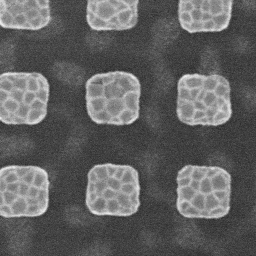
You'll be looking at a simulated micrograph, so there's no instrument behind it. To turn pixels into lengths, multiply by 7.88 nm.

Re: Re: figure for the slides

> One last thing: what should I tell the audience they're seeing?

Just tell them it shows raised bodies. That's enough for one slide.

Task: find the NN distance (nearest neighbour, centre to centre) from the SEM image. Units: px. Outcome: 90.4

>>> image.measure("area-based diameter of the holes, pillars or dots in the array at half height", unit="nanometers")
426